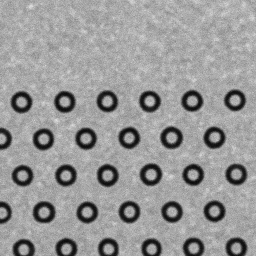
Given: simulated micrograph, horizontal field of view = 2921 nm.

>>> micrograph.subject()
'a regular array of ring-shaped grooves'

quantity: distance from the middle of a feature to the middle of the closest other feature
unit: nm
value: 480